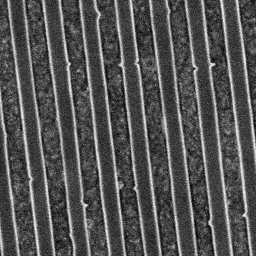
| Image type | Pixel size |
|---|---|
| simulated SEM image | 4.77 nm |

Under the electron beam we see parallel lines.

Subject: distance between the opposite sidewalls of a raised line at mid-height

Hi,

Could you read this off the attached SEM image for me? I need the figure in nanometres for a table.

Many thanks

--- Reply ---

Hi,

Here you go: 76.9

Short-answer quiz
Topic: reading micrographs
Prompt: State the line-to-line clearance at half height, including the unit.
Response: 90.5 nanometers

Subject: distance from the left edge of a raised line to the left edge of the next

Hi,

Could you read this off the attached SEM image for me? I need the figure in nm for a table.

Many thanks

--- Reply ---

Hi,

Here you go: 168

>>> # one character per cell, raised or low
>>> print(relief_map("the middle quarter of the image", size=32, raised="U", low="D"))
UDDDDDUUUUDDDDUUUUUDDDDUUUUUDDDD
UDDDDDUUUUDDDDDUUUUDDDDDUUUUDDDD
UDDDDDUUUUDDDDDUUUUDDDDDUUUUDDDD
UDDDDDUUUUDDDDDUUUUDDDDDUUUUDDDD
UDDDDDUUUUDDDDDUUUUDDDDDUUUUDDDD
UDDDDDUUUUUDDDDUUUUDDDDDUUUUDDDD
UUDDDDDUUUUDDDDUUUUDDDDDUUUUDDDD
UUDDDDDUUUUDDDDUUUUUDDDDUUUUDDDD
UUDDDDDUUUUDDDDDUUUUDDDDUUUUDDDD
UUDDDDDUUUUDDDDDUUUUDDDDDUUUDDDD
UUDDDDDUUUUDDDDDUUUUDDDDDUUUUDDD
UUDDDDDUUUUDDDDDUUUUDDDDDUUUUDDD
UUUDDDDUUUUDDDDDUUUUDDDDDUUUUDDD
UUUDDDDUUUUDDDDDUUUUDDDDDUUUUDDD
UUUDDDDUUUUDDDDDUUUUDDDDDUUUUDDD
UUUDDDDDUUUDDDDDUUUUDDDDDUUUUDDD
UUUDDDDDUUUUDDDDDUUUDDDDDUUUUUDD
UUUDDDDDUUUUDDDDDUUUUDDDDUUUUUDD
UUUDDDDDUUUUDDDDDUUUUDDDDDUUUUDD
UUUDDDDDUUUUDDDDDUUUUDDDDDUUUUDD
UUUDDDDDUUUUDDDDDUUUUDDDDDUUUUDD
UUUDDDDDUUUUDDDDDUUUUDDDDDUUUUDD
UUUDDDDDUUUUUDDDDUUUUDDDDDUUUUDD
UUUUDDDDUUUUUDDDDUUUUDDDDDUUUUDD
UUUUDDDDUUUUUDDDDUUUUDDDDDUUUUDD
UUUUDDDDDUUUUDDDDUUUUDDDDDUUUUUD
UUUUDDDDDUUUUDDDDUUUUUDDDDDUUUUD
UUUUDDDDDUUUUDDDDDUUUUDDDDDUUUUD
UUUUDDDDDUUUUDDDDDUUUUDDDDDUUUUD
UUUUDDDDDUUUUDDDDDUUUUDDDDDUUUUD
DUUUDDDDDUUUUDDDDDUUUUDDDDDUUUUD
DUUUUDDDDUUUUDDDDDUUUUDDDDDUUUUD